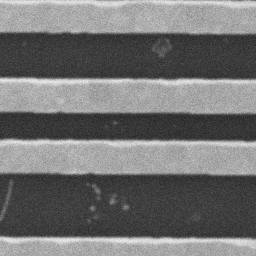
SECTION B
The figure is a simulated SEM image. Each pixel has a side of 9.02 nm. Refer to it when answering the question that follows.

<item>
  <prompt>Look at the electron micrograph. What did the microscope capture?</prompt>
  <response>lines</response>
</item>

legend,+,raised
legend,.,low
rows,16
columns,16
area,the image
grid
++++++++++++++++
++++++++++++++++
................
................
................
++++++++++++++++
++++++++++++++++
................
................
++++++++++++++++
++++++++++++++++
................
................
................
................
++++++++++++++++